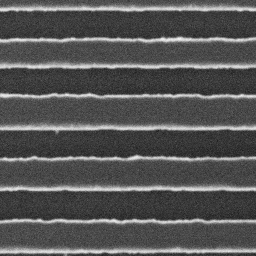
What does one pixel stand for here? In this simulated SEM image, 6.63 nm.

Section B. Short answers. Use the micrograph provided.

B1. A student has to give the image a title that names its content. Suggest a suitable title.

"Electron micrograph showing lines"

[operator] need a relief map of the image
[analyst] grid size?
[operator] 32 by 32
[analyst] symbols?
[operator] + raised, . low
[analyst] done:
++++++++++++++++++++++++++++++++
................................
................................
................................
................................
++++++++++++++++++++++++++++++++
++++++++++++++++++++++++++++++++
++++++++++++++++++++++++++++++++
................................
................................
................................
................................
++++++++++++++++++++++++++++++++
++++++++++++++++++++++++++++++++
++++++++++++++++++++++++++++++++
++++++++++++++++++++++++++++++++
................................
................................
................................
................................
++++++++++++++++++++++++++++++++
++++++++++++++++++++++++++++++++
++++++++++++++++++++++++++++++++
++++++++++++++++++++++++++++++++
................................
................................
................................
.++++..+....+++.+.......+.......
++++++++++++++++++++++++++++++++
++++++++++++++++++++++++++++++++
++++++++++++++++++++++++++++++++
........+.......................